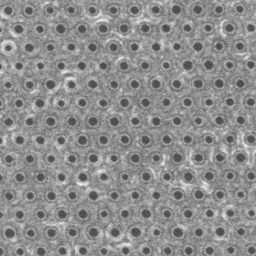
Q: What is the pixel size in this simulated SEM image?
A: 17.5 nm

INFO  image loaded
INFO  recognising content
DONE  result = a regular array of raised bodies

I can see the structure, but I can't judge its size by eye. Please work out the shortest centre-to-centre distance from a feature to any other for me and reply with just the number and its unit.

20.6 pixels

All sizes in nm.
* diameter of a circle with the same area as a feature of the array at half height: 175